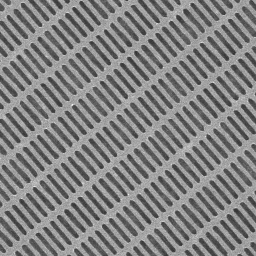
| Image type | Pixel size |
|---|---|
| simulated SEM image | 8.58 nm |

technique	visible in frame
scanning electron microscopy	a regular array of holes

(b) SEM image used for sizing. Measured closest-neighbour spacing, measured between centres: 78.1 nm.